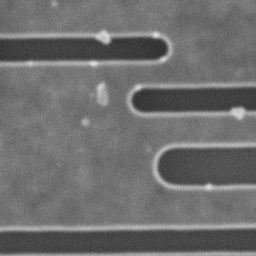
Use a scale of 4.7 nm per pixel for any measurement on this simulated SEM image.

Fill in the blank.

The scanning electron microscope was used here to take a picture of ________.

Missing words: groups of lines, slits or small figures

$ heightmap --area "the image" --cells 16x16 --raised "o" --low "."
oooooooooooooooo
oooooooooooooooo
......o...oooooo
..........oooooo
oooooooooooooooo
ooooooooo.......
oooooooo........
oooooooooooooooo
oooooooooooooooo
oooooooooo......
oooooooooo......
ooooooooooo.....
oooooooooooooooo
oooooooooooooooo
................
................